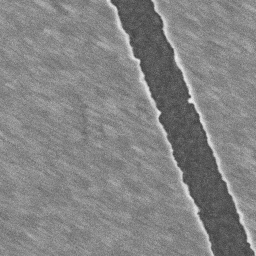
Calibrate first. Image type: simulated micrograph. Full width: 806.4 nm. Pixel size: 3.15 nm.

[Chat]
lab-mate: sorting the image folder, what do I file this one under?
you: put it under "one or a few lines or trenches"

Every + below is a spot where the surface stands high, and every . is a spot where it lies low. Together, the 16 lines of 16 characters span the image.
+++++++...++++++
++++++++..++++++
++++++++...+++++
++++++++...+++++
+++++++++..+++++
+++++++++...++++
++++++++++..++++
++++++++++...+++
++++++++++...+++
+++++++++++..+++
+++++++++++...++
++++++++++++..++
++++++++++++...+
++++++++++++...+
+++++++++++++..+
+++++++++++++...